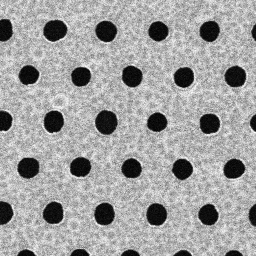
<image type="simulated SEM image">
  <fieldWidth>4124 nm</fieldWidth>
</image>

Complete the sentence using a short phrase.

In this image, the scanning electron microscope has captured a regular array of holes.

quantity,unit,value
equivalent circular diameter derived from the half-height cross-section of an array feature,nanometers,344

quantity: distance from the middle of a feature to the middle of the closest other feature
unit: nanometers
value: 827